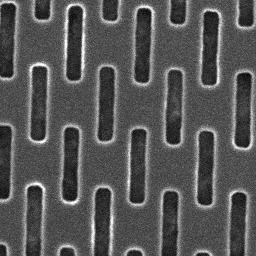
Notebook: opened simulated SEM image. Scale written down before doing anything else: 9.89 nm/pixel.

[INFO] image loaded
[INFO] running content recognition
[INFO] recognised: a regular array of holes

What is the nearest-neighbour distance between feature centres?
668 nm